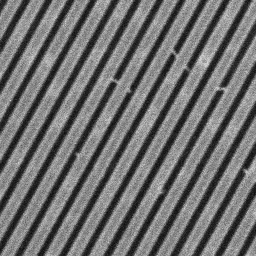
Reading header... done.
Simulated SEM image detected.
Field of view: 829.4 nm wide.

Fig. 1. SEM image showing parallel lines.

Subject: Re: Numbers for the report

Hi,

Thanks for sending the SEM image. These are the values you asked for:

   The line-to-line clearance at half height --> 7.44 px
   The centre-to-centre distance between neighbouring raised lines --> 19.4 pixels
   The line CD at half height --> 39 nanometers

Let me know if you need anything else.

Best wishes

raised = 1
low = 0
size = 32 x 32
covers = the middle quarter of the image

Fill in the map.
11100111001111001110011110011110
11001111001110011110011100111100
11001110011110011100111100111001
10011110011100111100111001111001
00011100111101111001111001110011
00111000111001110001110011110011
00111001110001110011100011100111
01110001110011100011100111000111
11110011100011100111000111001110
11100111100111001111001110001110
11100111001111001110011110011100
11001111001110011110011100111100
11001110011110011100111100111001
10011110011100111100111001111001
00011100111100111001111001110011
00111000111001110001110011110011
00111001110001110011100011100111
01110001110011100011100111000111
11110011100011100111000111001110
11100111100111000111001110001110
11100111001111001110011110011100
11001111001110011110011100111100
11011110011110011100111100111001
10011110011100111100111001111001
00011100111100111001111001110011
00111000111001111001110011110011
00111001110001110011100011100111
01110001110011100011100111000111
11110011100011100111000111001110
11100111100111000111001110001110
11100111001111001110001110011100
11001111001110011110011100111100